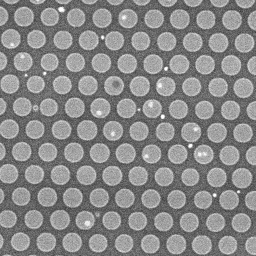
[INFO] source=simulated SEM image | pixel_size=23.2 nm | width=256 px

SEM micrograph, an array of small figures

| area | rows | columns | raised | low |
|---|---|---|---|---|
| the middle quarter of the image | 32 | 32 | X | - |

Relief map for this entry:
-XXXX--XXXX---XXXX--XXXXX--XXXX-
--XX----XXX---XXX---XXXX---XXXX-
--------------------------------
X----XX----XXX----XX-----X------
XX--XXXX--XXXXX--XXXX--XXXX---XX
XX--XXXX--XXXXX--XXXX--XXXXX--XX
X---XXXX--XXXXX--XXXX--XXXXX--XX
-----XX----XXX---XXX----XXX----X
--------------------------------
-XXXX--XXXX---XXX----XXX---XXX--
XXXXX--XXXX--XXXXX--XXXX---XXXX-
XXXXX--XXXX--XXXXX--XXXX---XXXX-
-XXX---XXXX---XXX---XXXX---XXXX-
----------------------------X---
X---XXX----XX-------------------
X---XXXX--XXXX---XXX----XXX---XX
XX-XXXXX--XXXXX--XXXX--XXXX---XX
X---XXXX--XXXXX--XXXX--XXXX---XX
----XXX----XXX---XXX----XXX---XX
--------------------------------
-XXX---XXXX---XXX----XX----XX---
XXXXX--XXXX--XXXXX--XXXX--XXXX--
XXXXX--XXXX--XXXXX--XXXX--XXXXX-
XXXX---XXXX--XXXX---XXXX--XXXX--
--------XX----XXX----XX----XXX--
--------------------------------
X---XXXX--XXXX---XXX----XXX----X
X--XXXXX--XXXX--XXXXX--XXXX---XX
X--XXXXX--XXXX--XXXXX--XXXX--XXX
X---XXX---XXXX---XXX---XXXX---XX
--------------------------------
-XXX----XX----XX----------------